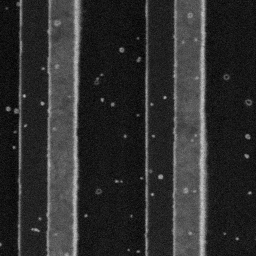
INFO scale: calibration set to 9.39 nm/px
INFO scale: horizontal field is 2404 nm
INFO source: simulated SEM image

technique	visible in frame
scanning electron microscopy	lines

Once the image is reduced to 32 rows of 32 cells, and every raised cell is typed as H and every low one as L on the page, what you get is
LLLHHHHHHLLLLLLLLLHHHHHHHLLLLLLL
LLLHHHHHHLLLLLLLLLHHHHHHHLLLLLLL
LLLHHHHHHLLLLLLLLLHHHHHHHLLLLLLL
LLLHHHHHHLLLLLLLLLHHHHHHHLLLLLLL
LLLHHHHHHLLLLLLLLLHHHHHHHLLLLLLL
LLLHHHHHHLLLLLLLLLHHHHHHHLLLLLLL
LLLHHHHHHLLLLLLLLLHHHHHHHLLLLLLL
LLLHHHHHHLLLLLLLLLHHHHHHHLLLLLLL
LLLHHHHHHLLLLLLLLLHHHHHHHLLLLLLL
LLLHHHHHHLLLLLLLLLHHHHHHHLLLLLLL
LLLHHHHHHLLLLLLLLLHHHHHHHLLLLLLL
LLLHHHHHHLLLLLLLLLHHHHHHHLLLLLLL
LLLHHHHHHLLLLLLLLLHHHHHHHLLLLLLL
LLLHHHHHHLLLLLLLLLHHHHHHHLLLLLLL
LLLHHHHHHLLLLLLLLLHHHHHHHLLLLLLL
LLLHHHHHHLLLLLLLLLHHHHHHHLLLLLLL
LLHHHHHHHLLLLLLLLLHHHHHHHLLLLLLL
LLLHHHHHHLLLLLLLLLHHHHHHHLLLLLLL
LLLHHHHHHLLLLLLLLLHHHHHHHLLLLLLL
LLLHHHHHHLLLLLLLLLHHHHHHHLLLLLLL
LLHHHHHHHLLLLLLLLLHHHHHHHLLLLLLL
LLHHHHHHHLLLLLLLLLHHHHHHHLLLLLLL
LLHHHHHHHLLLLLLLLLHHHHHHHLLLLLLL
LLHHHHHHHLLLLLLLLLHHHHHHHLLLLLLL
LLHHHHHHHLLLLLLLLLHHHHHHHLLLLLLL
LLHHHHHHHLLLLLLLLLHHHHHHHLLLLLLL
LLHHHHHHHLLLLLLLLLHHHHHHHLLLLLLL
LLHHHHHHHLLLLLLLLLHHHHHHHLLLLLLL
LLHHHHHHHLLLLLLLLLHHHHHHHLLLLLLL
LLHHHHHHHLLLLLLLLLHHHHHHHLLLLLLL
LLHHHHHHHLLLLLLLLLHHHHHHHLLLLLLL
LLHHHHHHHLLLLLLLLLHHHHHHHLLLLLLL